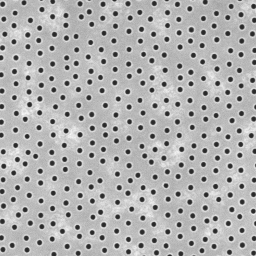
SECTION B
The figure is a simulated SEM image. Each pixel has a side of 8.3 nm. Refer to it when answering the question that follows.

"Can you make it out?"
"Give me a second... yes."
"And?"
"a regular array of holes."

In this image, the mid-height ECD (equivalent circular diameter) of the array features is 5.05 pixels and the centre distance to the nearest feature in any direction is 103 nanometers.